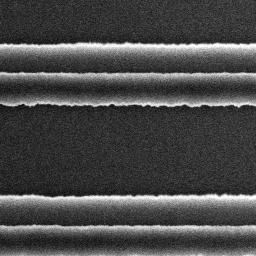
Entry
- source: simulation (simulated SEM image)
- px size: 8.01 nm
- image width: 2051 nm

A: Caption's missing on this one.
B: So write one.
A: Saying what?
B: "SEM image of lines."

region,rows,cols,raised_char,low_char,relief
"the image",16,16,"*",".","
................
................
................
****************
****************
****************
**.*************
................
................
................
................
................
****************
****************
****************
****************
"